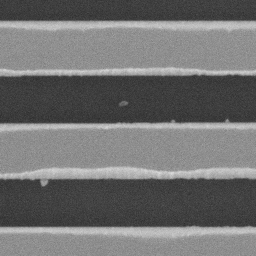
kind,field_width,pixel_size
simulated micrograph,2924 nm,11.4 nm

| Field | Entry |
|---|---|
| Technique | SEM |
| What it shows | lines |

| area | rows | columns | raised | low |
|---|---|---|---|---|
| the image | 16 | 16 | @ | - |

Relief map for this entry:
----------------
@@@@@@@@@@@@@@@@
@@@@@@@@@@@@@@@@
@@@@@@@@@@@@@@@@
@@@@@@@@@@@@@@@@
----------------
----------------
----------------
@@@@@@@@@@@@@@@@
@@@@@@@@@@@@@@@@
@@@@@@@@@@@@@@@@
----------------
----------------
----------------
@@@@@@@@@@@@@@@@
@@@@@@@@@@@@@@@@